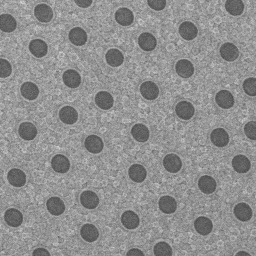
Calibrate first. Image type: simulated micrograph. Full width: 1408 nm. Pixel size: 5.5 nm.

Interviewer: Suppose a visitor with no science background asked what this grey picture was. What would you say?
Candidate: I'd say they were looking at a regular array of holes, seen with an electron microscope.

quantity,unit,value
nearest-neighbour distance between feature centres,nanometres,212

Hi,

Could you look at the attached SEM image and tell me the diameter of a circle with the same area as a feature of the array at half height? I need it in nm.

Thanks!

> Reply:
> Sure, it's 107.